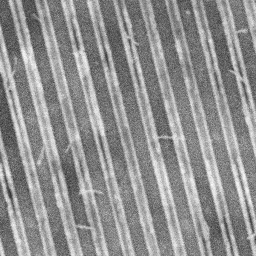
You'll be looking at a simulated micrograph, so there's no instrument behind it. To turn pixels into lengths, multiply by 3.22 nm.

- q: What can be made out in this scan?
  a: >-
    parallel lines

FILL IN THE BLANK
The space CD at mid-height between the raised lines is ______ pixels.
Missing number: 15.8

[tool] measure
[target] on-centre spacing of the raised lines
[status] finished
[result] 0.0814 um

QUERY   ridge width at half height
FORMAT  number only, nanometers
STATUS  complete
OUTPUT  30.8